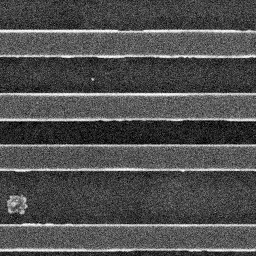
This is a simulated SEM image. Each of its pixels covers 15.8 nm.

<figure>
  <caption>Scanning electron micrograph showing lines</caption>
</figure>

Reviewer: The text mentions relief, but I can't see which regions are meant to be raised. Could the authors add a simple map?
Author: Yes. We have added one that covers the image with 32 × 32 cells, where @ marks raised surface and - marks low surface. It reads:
--------------------------------
--------------------------------
--------------------------------
--------------------------------
@@@@@@@@@@@@@@@@@@@@@@@@@@@@@@@@
@@@@@@@@@@@@@@@@@@@@@@@@@@@@@@@@
@@@@@@@@@@@@@@@@@@@@@@@@@@@@@@@@
--------------------------------
--------------------------------
--------------------------------
--------------------------------
--------------------------------
@@@@@@@@@@@@@@@@@@@@@@@@@@@@@@@@
@@@@@@@@@@@@@@@@@@@@@@@@@@@@@@@@
@@@@@@@@@@@@@@@@@@@@@@@@@@@@@@@@
--------------------------------
--------------------------------
--------------------------------
@@@@@@@@@@@@@@@@@@@@@@@@@@@@@@@@
@@@@@@@@@@@@@@@@@@@@@@@@@@@@@@@@
@@@@@@@@@@@@@@@@@@@@@@@@@@@@@@@@
--------------------------------
--------------------------------
--------------------------------
--------------------------------
--------------------------------
--------------------------------
--------------------------------
@@@@@@@@@@@@@@@@@@@@@@@@@@@@@@@@
@@@@@@@@@@@@@@@@@@@@@@@@@@@@@@@@
@@@@@@@@@@@@@@@@@@@@@@@@@@@@@@@@
--------------------------------